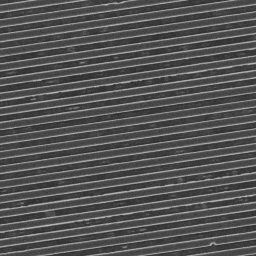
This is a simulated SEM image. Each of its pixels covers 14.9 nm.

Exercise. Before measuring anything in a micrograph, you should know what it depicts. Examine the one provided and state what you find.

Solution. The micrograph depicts parallel lines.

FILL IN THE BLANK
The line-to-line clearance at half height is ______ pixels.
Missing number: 6.8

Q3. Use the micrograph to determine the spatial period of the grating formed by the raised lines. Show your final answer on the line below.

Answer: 0.217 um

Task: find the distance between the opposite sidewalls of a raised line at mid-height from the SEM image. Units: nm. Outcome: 116